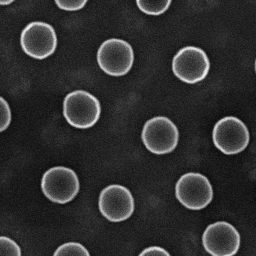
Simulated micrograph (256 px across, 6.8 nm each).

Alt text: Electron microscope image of a regular array of raised bodies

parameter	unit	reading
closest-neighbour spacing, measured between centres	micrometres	0.442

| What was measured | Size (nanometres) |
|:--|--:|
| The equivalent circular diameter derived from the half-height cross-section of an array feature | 245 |